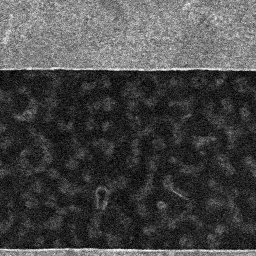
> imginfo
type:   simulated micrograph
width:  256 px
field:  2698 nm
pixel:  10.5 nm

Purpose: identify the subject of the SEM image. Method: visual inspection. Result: one or a few lines or trenches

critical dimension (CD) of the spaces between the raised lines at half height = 1900 nanometers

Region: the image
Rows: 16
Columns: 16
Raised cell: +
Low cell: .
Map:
++++++++++++++++
++++++++++++++++
++++++++++++++++
++++++++++++++++
................
................
................
................
................
................
................
................
................
................
................
................